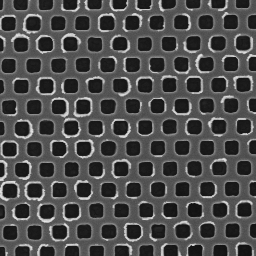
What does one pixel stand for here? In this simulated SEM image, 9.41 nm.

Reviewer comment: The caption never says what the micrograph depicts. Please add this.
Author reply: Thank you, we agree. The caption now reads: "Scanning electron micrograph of a regular array of holes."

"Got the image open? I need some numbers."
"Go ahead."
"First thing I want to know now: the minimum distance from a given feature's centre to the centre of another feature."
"23.9 pixels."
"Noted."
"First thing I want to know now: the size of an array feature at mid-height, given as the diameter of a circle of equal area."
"144 nm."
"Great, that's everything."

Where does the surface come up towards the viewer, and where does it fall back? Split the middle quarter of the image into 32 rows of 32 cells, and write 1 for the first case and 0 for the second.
01100001100001100001110001100001
11100011100011110001110001110001
11111111111111111111111111111111
11111111111111111111011110011111
00011100001100001110001110001110
00001100001100001100001100001110
00011100011110001110001110001110
11111111111111111111111111111111
11111111111111111111111111111111
11100011100001110001110001110001
01100001100001100001100001110001
01100001100001110001110001110001
11110011111111111111111111111111
11111111111111111111111111111111
00011110011110001110001110001110
00001100001100001100001110001110
00001100001100001100001110001110
00011110011110011110011110011111
11111111111111111111111111111111
11110011110011110001110001110001
11100001100001100001110001110001
01100001100001100001110001110001
11100011110011110001110001110001
11111111111111111111111111111111
11111110011110011111011111011111
00001100001100001110001110001110
00001100001100001110001110001110
00001100001110001110001110001110
11111111111111111111111111111111
11111111111111111111111011111011
01100001100001110001110001110001
01100001100001110001110001110001